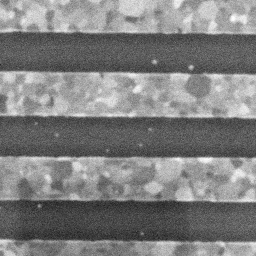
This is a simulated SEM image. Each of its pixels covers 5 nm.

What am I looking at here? lines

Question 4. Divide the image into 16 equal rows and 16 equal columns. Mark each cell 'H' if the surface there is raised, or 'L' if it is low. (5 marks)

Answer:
HHHHHHHHHHHHHHHH
HHHHHHHHHHHHHHHH
LLLLLLLLLLLLLLLL
LLLLLLLLLLLLLLLL
LLLLLLLLLLLLLLLL
HHHHHHHHHHHHHHHH
HHHHHHHHHHHHHHHH
LLLLLLLLLLLLLLLL
LLLLLLLLLLLLLLLL
LLLLLLLLLLLLLLLL
HHHHHHHHHHHHHHHH
HHHHHHHHHHHHHHHH
LLLLHHHHHHHHHHHH
LLLLLLLLLLLLLLLL
LLLLLLLLLLLLLLLL
HHHHHHHHHHHHHHHH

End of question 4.